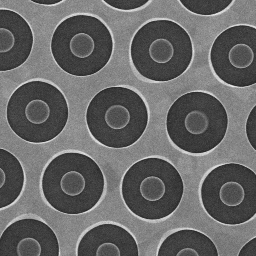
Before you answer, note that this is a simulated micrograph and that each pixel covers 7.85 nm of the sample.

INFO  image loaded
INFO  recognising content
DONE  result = an array of small figures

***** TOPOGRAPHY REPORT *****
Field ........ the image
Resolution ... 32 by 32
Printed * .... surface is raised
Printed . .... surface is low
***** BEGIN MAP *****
*****..******.....*****......***
..**********************....****
...*****.....******..***********
....***......*****.....******...
....***.......***.......***.....
....**........**........***.....
....**........**........**......
...****.......**........**......
..******.....****......****.....
*****************.....*****.....
***....*********************....
**......****.....*******..******
*.......***.......****.....*****
*.......***.......***.......****
*........**........**.......***.
*.......***.......***.......***.
**......***.......***.......***.
***...******.....****.......***.
**************.*******.....*****
..*****....*********************
...***......*****....*******..**
...**........***......****......
...**........**........**.......
...**........**........**.......
..***........**........**.......
.*****......****......***.......
********...*****......****......
**...*************..*******....*
*.....*****.....****************
.......***.......****.....******
.......***.......***.......****.
.......***.......***.......***..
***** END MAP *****